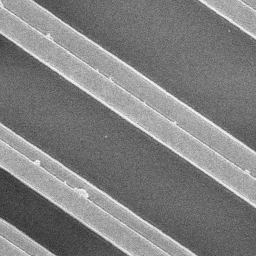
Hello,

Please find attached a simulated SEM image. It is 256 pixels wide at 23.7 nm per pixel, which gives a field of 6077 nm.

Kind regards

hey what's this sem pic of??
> lines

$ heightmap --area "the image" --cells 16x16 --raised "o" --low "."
ooo..........ooo
oooo...........o
.ooooo..........
..ooooo.........
....oooo........
.....ooooo......
.......oooo.....
........ooooo...
o.........oooo..
ooo........ooooo
oooo........oooo
..oooo........oo
...oooo........o
.....ooo........
o.....oooo......
ooo.....ooo.....